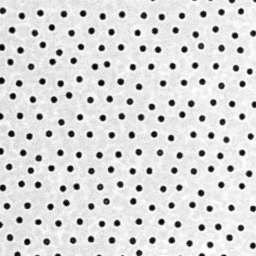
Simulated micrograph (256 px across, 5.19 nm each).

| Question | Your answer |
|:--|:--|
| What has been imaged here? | a regular array of holes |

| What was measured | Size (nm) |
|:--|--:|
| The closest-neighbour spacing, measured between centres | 87.2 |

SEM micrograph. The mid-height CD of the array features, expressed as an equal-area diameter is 41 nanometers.